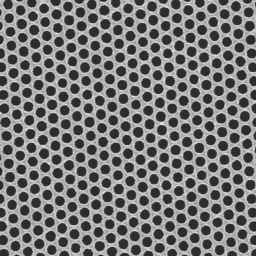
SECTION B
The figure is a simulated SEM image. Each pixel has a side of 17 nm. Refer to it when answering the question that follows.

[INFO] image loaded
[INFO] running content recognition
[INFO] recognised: a regular array of holes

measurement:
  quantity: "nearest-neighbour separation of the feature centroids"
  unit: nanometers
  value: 231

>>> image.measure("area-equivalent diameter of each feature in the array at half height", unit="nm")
181